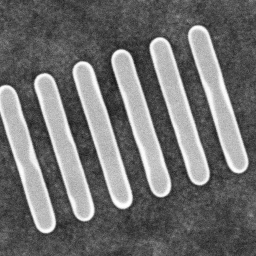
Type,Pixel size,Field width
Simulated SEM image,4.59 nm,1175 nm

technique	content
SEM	groups of lines, slits or small figures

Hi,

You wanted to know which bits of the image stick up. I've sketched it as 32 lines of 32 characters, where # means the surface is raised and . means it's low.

................................
................................
................................
........................#.......
........................##......
...................##...###.....
...............#...###..###.....
..............###..###..###.....
.........##...###..###...##.....
.....#...###..###...##...###....
....###...##...##...###..###....
##...##...##...###..###...##....
##...###..###...##...##...##....
###..###..###...##...###..###...
###...##...###..###..###...##...
.##...##...###..###...##...###..
.###..###..###...##...###..###..
.###..###...##...###..###..###..
.###...###..###..###...##...###.
..##...###..###...##...###..###.
..###..###...##...###..###...##.
...##...##...###..###..###......
...##...###..###...##...##......
...###..###...##...##...........
...###...##...##................
....##...##....#................
....###..###....................
....###...#.....................
.....#..........................
................................
................................
................................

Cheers